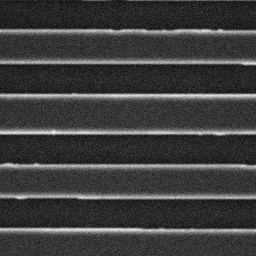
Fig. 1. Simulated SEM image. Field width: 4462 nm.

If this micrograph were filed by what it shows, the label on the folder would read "lines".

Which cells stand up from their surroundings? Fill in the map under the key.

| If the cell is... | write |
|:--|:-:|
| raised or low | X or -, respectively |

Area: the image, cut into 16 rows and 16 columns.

----------------
----------------
XXXXXXXXXXXXXXXX
XXXXXXXXXXXXXXXX
----------------
----------------
XXXXXXXXXXXXXXXX
XXXXXXXXXXXXXXXX
----------------
----------------
XXXXXXXXXXXXXXXX
XXXXXXXXXXXXXXXX
----------------
----------------
XXXXXXXXXXXXXXXX
XXXXXXXXXXXXXXXX